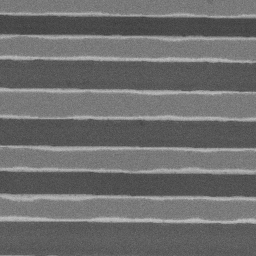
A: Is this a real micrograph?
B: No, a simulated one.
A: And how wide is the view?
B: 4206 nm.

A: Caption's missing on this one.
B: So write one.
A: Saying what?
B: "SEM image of lines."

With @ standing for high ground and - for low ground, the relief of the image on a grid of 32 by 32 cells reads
@@@@@@@@@@@@@@@@@@@@@@@@@@@@@@@@
@@@@@@@@@@@@@@@@@@@@@@@@@@@@@@@@
--------------------------------
--------------------------------
@@@@@@--------------------------
@@@@@@@@@@@@@@@@@@@@@@@@@@@@@@@@
@@@@@@@@@@@@@@@@@@@@@@@@@@@@@@@@
------------------@@@@@@@@@@@@@@
--------------------------------
--------------------------------
--------------------------------
@@@@@@@@@@@@@@@@@@@@@@@@@@@@@---
@@@@@@@@@@@@@@@@@@@@@@@@@@@@@@@@
@@@@@@@@@@@@@@@@@@@@@@@@@@@@@@@@
@@@@@@@@@@@@@@@@@@@@@@@@@@@@@@@@
--------------------------------
--------------------------------
--------------------------------
@@@@@@@@@@@@@@@@@@@@@@----------
@@@@@@@@@@@@@@@@@@@@@@@@@@@@@@@@
@@@@@@@@@@@@@@@@@@@@@@@@@@@@@@@@
---------------@@@@@@@@-@@@@@@@@
--------------------------------
--------------------------------
@@--@@@-----@-------------------
@@@@@@@@@@@@@@@@@@@@@@@@@@@@@@@@
@@@@@@@@@@@@@@@@@@@@@@@@@@@@@@@@
------@@@@@@-@@@@@@@@@@@@@@@@@@@
--------------------------------
--------------------------------
--------------------------------
--------------------------------